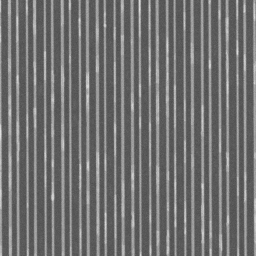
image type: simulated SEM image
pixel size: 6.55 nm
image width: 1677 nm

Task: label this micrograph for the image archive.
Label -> parallel lines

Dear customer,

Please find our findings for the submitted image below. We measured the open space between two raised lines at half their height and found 7.11 px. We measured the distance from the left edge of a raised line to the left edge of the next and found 0.0571 microns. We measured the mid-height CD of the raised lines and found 12.3 nm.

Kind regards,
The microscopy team